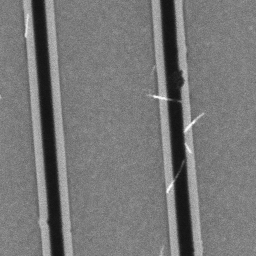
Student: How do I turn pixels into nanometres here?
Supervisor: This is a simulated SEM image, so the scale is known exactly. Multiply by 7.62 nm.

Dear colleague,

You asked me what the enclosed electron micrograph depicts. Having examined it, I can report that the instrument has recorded one or a few lines or trenches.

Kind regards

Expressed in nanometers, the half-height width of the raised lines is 183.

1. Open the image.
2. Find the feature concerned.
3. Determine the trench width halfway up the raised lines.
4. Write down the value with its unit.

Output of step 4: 798 nm